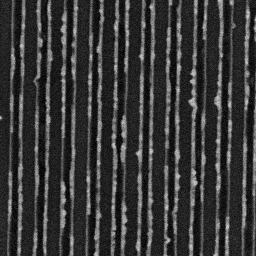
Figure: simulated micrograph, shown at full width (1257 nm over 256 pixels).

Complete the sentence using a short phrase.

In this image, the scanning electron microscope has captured parallel lines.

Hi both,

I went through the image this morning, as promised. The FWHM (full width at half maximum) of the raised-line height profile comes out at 62.6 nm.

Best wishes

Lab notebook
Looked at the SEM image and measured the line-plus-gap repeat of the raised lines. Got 128 nm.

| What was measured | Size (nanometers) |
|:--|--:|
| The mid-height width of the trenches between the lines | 62.6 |